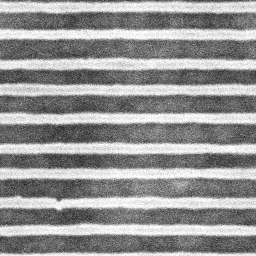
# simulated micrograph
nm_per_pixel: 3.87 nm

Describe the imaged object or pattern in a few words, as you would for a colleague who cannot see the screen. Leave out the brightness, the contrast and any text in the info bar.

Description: parallel lines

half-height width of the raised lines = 29.5 nanometers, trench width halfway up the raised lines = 78.8 nanometers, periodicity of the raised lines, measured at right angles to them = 108 nm